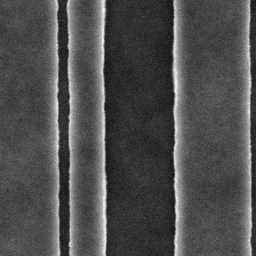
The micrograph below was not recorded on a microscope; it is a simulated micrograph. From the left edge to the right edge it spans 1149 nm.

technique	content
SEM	lines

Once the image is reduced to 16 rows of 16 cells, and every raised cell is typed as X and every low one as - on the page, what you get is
XXXXXX-----XXXXX
XXXXXX-----XXXXX
XXXXXX-----XXXXX
XXXXXX-----XXXXX
XXXXXX-----XXXXX
XXXXXX-----XXXXX
XXXXXX-----XXXXX
XXXXXX-----XXXXX
XXXXXX-----XXXXX
XXXXXX-----XXXXX
XXXXXX-----XXXXX
XXXXXXX----XXXXX
XXXXXXX----XXXXX
XXXXXXX----XXXXX
XXXXXXX----XXXXX
XXXXXXX----XXXXX